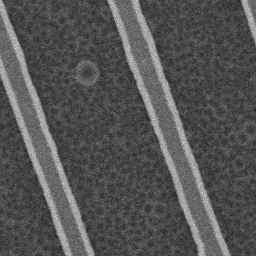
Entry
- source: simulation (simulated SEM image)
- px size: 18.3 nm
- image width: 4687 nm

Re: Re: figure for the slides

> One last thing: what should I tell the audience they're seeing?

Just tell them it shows one or a few lines or trenches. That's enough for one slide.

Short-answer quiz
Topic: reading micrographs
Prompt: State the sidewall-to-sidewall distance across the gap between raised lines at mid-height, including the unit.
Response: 1910 nanometers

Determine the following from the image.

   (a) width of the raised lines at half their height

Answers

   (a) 398 nanometers